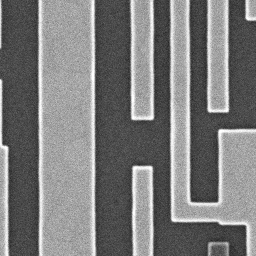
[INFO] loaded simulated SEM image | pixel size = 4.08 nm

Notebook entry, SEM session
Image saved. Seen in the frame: wiring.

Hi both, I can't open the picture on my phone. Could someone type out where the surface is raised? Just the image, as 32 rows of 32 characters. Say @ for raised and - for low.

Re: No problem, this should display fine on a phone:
-----@@@@@@@----@@@--@@@--@@---@
-----@@@@@@@----@@@--@@@--@@---@
-----@@@@@@@----@@@--@@@--@@----
-----@@@@@@@----@@@--@@@--@@----
-----@@@@@@@-----@@--@@@--@@----
-----@@@@@@@----@@@--@@@--@@----
-----@@@@@@@----@@@--@@@--@@----
-----@@@@@@@----@@@--@@@--@@----
-----@@@@@@@----@@@--@@@--@@----
-----@@@@@@@----@@@--@@@--@@----
-----@@@@@@@----@@@--@@@--@@----
-----@@@@@@@----@@@--@@@--@@@---
-----@@@@@@@-----@@--@@@--@@@---
-----@@@@@@@-----@@--@@@--@@@---
-----@@@@@@@-----@@--@@@--------
-----@@@@@@@---------@@@--------
-----@@@@@@@---------@@@----@@@@
-----@@@@@@@---------@@@---@@@@@
@----@@@@@@@---------@@@---@@@@@
@----@@@@@@@---------@@@---@@@@@
@----@@@@@@@---------@@@---@@@@@
@----@@@@@@@-----@@--@@@---@@@@@
@----@@@@@@@-----@@--@@@---@@@@@
@----@@@@@@@-----@@--@@@---@@@@@
@----@@@@@@@-----@@--@@@---@@@@@
@----@@@@@@@-----@@--@@@@@@@@@@@
@----@@@@@@@-----@@--@@@@@@@@@@@
@----@@@@@@@-----@@---@@@@@@@@@@
@----@@@@@@@-----@@------------@
@----@@@@@@@-----@@------------@
@----@@@@@@@-----@@-------@@---@
@----@@@@@@@-----@@-------@@@--@